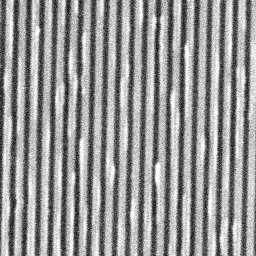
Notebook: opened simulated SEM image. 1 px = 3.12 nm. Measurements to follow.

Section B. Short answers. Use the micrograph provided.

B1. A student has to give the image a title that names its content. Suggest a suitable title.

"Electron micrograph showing parallel lines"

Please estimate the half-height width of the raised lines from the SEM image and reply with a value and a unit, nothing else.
19.5 nm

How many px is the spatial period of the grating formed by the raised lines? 12.9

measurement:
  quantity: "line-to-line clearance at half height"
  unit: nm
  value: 19.5